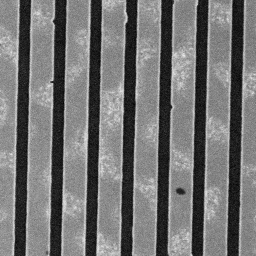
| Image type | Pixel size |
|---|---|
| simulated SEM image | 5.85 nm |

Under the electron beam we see parallel lines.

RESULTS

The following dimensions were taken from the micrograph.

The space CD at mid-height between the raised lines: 73.1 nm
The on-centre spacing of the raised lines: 207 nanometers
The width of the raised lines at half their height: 135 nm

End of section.